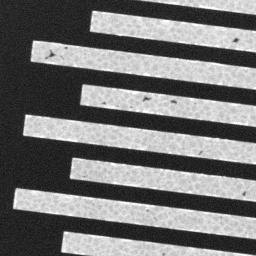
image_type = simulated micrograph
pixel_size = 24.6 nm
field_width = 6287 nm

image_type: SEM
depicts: parallel lines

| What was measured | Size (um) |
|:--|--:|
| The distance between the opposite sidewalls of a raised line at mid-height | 0.5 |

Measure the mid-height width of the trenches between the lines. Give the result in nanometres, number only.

417